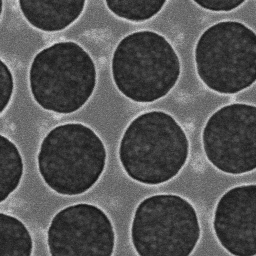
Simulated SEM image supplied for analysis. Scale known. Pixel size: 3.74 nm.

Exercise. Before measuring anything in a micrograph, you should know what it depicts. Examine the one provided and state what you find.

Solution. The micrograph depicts holes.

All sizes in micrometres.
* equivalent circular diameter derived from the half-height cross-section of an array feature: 0.258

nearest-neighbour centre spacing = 307 nanometers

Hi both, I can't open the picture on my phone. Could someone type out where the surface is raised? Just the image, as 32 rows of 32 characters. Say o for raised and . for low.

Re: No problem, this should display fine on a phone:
oo.........oo.......ooooo.....oo
ooo.......oooo......oooooooooooo
ooo......ooooooo..oooooooooooooo
ooooo...oooooooooooooooooo.....o
oooooooooooooooo....ooooo.......
ooooooo...ooooo......oooo.......
ooooo......ooo........oo........
oooo.......ooo........oo........
.ooo........oo........ooo.......
.ooo........oo........ooo.......
..oo........ooo.......oooo.....o
..oo........ooo......oooooo...oo
.ooo.......oooooo..ooooooooooooo
.oooo.....oooooooooooooooooo....
oooooooooooooooooo...ooooo......
ooooooooo.oooooo......oooo......
oooooo......oooo.......oo.......
.oooo.......ooo........oo.......
..ooo........oo.........oo......
...oo........oo........ooo......
...oo........oo........oooo.....
...oo........ooo......oooooo...o
...ooo......ooooo....ooooooooooo
..oooo.....oooooooooooooooooo...
.oooooooooooooooooo...oooooo....
oooooooooooooooooo......ooo.....
ooooooo......oooo.......ooo.....
..ooooo.......ooo........oo.....
...ooo........oo.........oo.....
....oo........oo.........oo.....
....oo........ooo.......oooo....
....oo........ooo.......ooooo...